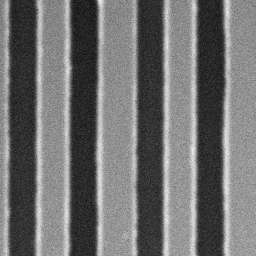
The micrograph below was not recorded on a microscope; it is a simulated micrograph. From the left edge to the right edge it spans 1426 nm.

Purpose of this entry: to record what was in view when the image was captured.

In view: lines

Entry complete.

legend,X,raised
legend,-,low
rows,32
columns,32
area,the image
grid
X----XXX----XXXXX----XXX----XXXX
X----XXX-----XXXX----XXX----XXXX
X----XXX-----XXXX----XXX----XXXX
X----XXX-----XXXX----XXX----XXXX
X----XXX-----XXXX----XXX----XXXX
X----XXX-----XXXX----XXX----XXXX
X----XXX-----XXXX----XXX----XXXX
X----XXX-----XXXX----XXX----XXXX
X----XXX-----XXXX----XXX----XXXX
X----XXX-----XXXX----XXX----XXXX
X----XXX-----XXXX----XXX----XXXX
X----XXX----XXXXX----XXX----XXXX
X----XXX-----XXXX----XXX----XXXX
X----XXX----XXXXX----XXX----XXXX
X----XXX----XXXXX----XXX----XXXX
X----XXX----XXXXX----XXX----XXXX
X----XXX----XXXXX----XXX----XXXX
X----XXX----XXXXX----XXX----XXXX
X----XXX----XXXXX----XXX----XXXX
X----XXX----XXXXX----XXX----XXXX
X----XXX----XXXXX----XXX----XXXX
X----XXX----XXXXX----XXX----XXXX
X----XXX----XXXXX----XXX----XXXX
X----XXX----XXXXX----XXX----XXXX
X----XXX----XXXXX----XXX----XXXX
X----XXX----XXXXX----XXX----XXXX
X----XXX----XXXXX----XXX----XXXX
X----XXX----XXXXX----XXX----XXXX
X----XXX----XXXXX----XXX----XXXX
X----XXX----XXXXX----XXX----XXXX
X----XXX----XXXXX----XXX----XXXX
X----XXX----XXXXX----XXX----XXXX